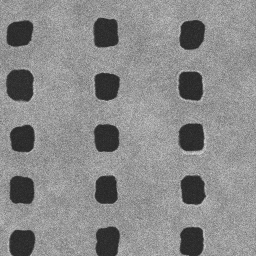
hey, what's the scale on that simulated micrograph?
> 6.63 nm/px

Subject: a regular array of holes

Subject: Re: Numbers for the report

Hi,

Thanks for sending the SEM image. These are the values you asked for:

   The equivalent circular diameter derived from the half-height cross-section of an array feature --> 0.183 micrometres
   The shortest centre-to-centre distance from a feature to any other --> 0.343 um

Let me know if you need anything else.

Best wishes